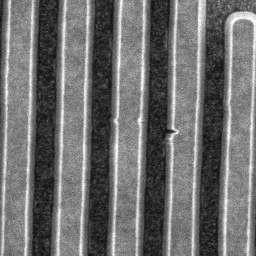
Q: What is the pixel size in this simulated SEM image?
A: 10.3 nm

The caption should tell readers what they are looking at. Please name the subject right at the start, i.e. parallel lines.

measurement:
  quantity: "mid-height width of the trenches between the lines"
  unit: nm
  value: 281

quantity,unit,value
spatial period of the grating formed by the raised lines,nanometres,573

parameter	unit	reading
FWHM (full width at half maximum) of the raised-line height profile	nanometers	290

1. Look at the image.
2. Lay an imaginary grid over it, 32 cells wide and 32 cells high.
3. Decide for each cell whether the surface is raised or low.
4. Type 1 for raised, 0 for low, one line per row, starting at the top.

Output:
01110000111000011100001110000000
01110000111000011100001110000000
01110000111000011100001110000111
01110000111000011100001110000111
01110000111000011100001110000111
01110000111000011100001110000111
01110000111000011100011110000111
01110000111000011100001110000111
01110000111000011100001110000111
11110000111000011100011110000111
01110000111000011100011110000111
01110000111000011100011110001111
01110000111000111100011110001111
01110000111000111100011110001111
01110001111000111100011110001111
01110001111000111100011110001111
01110001111000111100011110001111
11110001111000111100011110001111
11110001111000111100011110001111
11110001111000111100011110001111
11110001111000111100011110001111
11110001111000111100011110001111
11110001111000111100011110001111
11110001111000111100011100001111
11110001111000111100011100001111
11110001111000111100011100001110
11110001111000111000011100001110
11110001111000111000011100001110
11110001110000111000011100001110
11110001110000111000011100001110
11110001110000111000011100001110
11100001110000111000011100001110